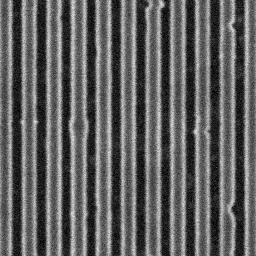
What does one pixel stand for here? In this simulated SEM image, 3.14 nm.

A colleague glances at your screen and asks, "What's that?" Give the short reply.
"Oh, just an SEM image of parallel lines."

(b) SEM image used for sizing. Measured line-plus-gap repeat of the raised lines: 24.8 pixels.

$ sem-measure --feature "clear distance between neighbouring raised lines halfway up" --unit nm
35.4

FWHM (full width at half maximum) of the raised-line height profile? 43.2 nm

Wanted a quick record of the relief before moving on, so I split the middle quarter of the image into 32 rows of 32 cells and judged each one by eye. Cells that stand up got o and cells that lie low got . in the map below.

..ooo...ooo....ooo...ooo...ooo..
..ooo...ooo...oooo...ooo...ooo..
..ooo...oooo..oooo...ooo...ooo..
..ooo...oooo..oooo...ooo...ooo..
..ooo...oooo..oooo...ooo...ooo..
..ooo...oooo..oooo...ooo...ooo..
..ooo...oooo..oooo...ooo...ooo..
..ooo...oooo..oooo...ooo...ooo..
..ooo...ooo...oooo...ooo...ooo..
..ooo...ooo...oooo...ooo...ooo..
..ooo...ooo...oooo...ooo...ooo..
..ooo...ooo....ooo...ooo...ooo..
..ooo...oooo...ooo...ooo...ooo..
..oooo..oooo...ooo...ooo...ooo..
..oooo..oooo...ooo...ooo...ooo..
..oooo..oooo...ooo...ooo...ooo..
..oooo..oooo...ooo...ooo...ooo..
..oooo..oooo...ooo...ooo...ooo..
..oooo..oooo..oooo...ooo...ooo..
..ooo...oooo..oooo...ooo...ooo..
..ooo...oooo...ooo...ooo...ooo..
..ooo...oooo...ooo...ooo...ooo..
..ooo...oooo...ooo...ooo...ooo..
..ooo...ooo....ooo...ooo...ooo..
..ooo...ooo....ooo...ooo...ooo..
..ooo...ooo...oooo...ooo...ooo..
..ooo...ooo....ooo...ooo...ooo..
..ooo...oooo...ooo...ooo...ooo..
..ooo...oooo...ooo...ooo...ooo..
..ooo...oooo...ooo...ooo...ooo..
..ooo...oooo...ooo...ooo...ooo..
..ooo...oooo...ooo...ooo...ooo..